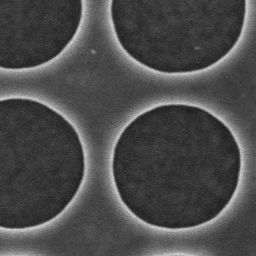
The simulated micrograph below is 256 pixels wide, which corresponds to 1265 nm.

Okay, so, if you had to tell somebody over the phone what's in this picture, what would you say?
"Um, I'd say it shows holes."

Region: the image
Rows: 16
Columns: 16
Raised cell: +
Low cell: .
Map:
.....++........+
.....++........+
....+++........+
...+++++......++
++++++++++..++++
++++++++++++++++
...+++++++++++++
....++++......++
.....+++.......+
.....++........+
.....++........+
.....++........+
....++++......++
....+++++.....++
++++++++++++++++
++++++++++++++++